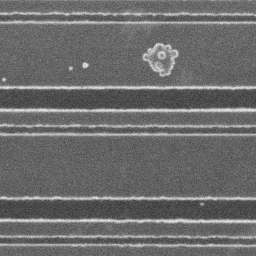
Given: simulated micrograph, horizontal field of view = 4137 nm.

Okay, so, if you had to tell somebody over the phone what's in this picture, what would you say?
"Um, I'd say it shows lines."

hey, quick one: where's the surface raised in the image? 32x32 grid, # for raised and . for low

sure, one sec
################################
################################
################################
################################
################################
################################
################################
################################
################################
################################
################################
................................
................................
................................
################################
################################
################################
################################
################################
################################
################################
################################
################################
################################
################################
................................
................................
................................
################################
################################
################################
################################